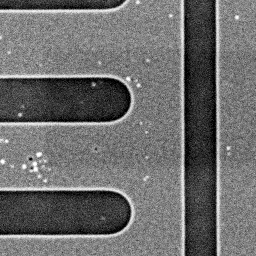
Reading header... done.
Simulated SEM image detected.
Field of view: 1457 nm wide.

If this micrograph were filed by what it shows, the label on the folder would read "groups of lines, slits or small figures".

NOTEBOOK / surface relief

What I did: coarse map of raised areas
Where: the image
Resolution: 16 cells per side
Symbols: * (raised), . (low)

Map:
.......****...**
***********...**
***********...**
***********...**
***********...**
........***...**
........***...**
.......****...**
************..**
************..**
***********...**
***********...**
........****..**
........****..**
.......*****..**
************..**